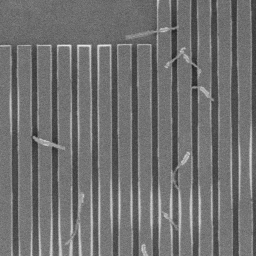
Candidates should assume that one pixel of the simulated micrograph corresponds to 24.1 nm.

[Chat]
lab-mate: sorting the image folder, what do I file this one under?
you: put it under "groups of lines, slits or small figures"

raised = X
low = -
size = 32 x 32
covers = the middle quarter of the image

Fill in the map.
XX--XXX--XXX--XXX--XXX-XXXX--XXX
XX--XXX--XXX--XXX--XXX-XXXX--XXX
XX--XXX--XXX--XXX--XXX-XXXX--XXX
XX--XXX--XXX--XXX--XXX-XXXX--XXX
XX--XXX--XXX--XXX--XXX-XXXX--XXX
XX--XXX--XXX--XXX--XXX--XXX--XXX
XX--XXX--XXX--XXX--XXX--XXX--XXX
XX--XXX-XXXX--XXX--XXX--XXX--XXX
XX--XXX-XXXX--XXX--XXX--XXX--XXX
XX--XXX-XXXX--XXX--XXX--XXX--XXX
XX--XXX--XXX--XXX--XXX--XXX--XXX
XX--XXX--XXX--XXX--XXX--XXX--XXX
XX--XXX--XXX--XXX--XXX--XXX--XXX
XX--XXX--XXX--XXX--XXX--XXX--XXX
XX--XXX--XXX--XXX--XXX--XXX--XXX
XX--XXX--XXX--XXX--XXX--XXX--XXX
XX--XXX--XXX--XXX--XXX--XXX--XXX
XX--XXX--XXX--XXX--XXX--XXX--XXX
XX--XXX--XXX--XXX--XXX--XXX--XXX
XX--XXX--XXX--XXX--XXX--XXX--XXX
XX--XXX--XXX--XXX--XXX--XXX--XXX
XX--XXX--XXX--XXX--XXX--XXX--XXX
XX--XXX--XXX--XXX--XXX--XXX--XXX
XX--XXX--XXX--XXX--XXX--XXX--XXX
XX--XXX--XXX--XXX--XXX--XXX--XXX
XX--XXX--XXX--XXX--XXX--XXX--XXX
XX--XXX--XXX--XXX--XXX--XXX--XXX
XX--XXX--XXX--XXX--XXX--XXX--XXX
XX--XXX--XXX--XXX--XXX--XXX--XXX
XX--XXX--XXX--XXX--XXX--XXX--XXX
XX--XXX--XXX--XXX--XXX--XXX--XXX
XX--XXX--XXX--XXX--XXX--XXX--XXX